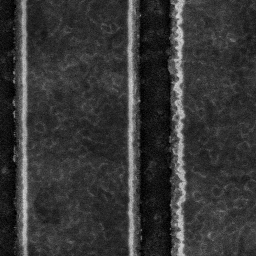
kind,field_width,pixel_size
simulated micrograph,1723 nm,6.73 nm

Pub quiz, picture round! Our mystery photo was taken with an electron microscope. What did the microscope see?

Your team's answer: one or a few lines or trenches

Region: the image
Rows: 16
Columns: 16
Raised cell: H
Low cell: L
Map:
LLHHHHHHLLLHHHHH
LLHHHHHHLLLHHHHH
LLHHHHHHLLLHHHHH
LLHHHHHHLLLHHHHH
LLHHHHHHLLLHHHHH
LLHHHHHHLLLHHHHH
LLHHHHHHLLLHHHHH
LHHHHHHHLLLHHHHH
LLHHHHHHLLLHHHHH
LLHHHHHHLLLHHHHH
LLHHHHHHLLLHHHHH
LLHHHHHHLLLHHHHH
LLHHHHHHLLLHHHHH
LLHHHHHHLLLHHHHH
LLHHHHHHLLLHHHHH
LLHHHHHHLLLHHHHH